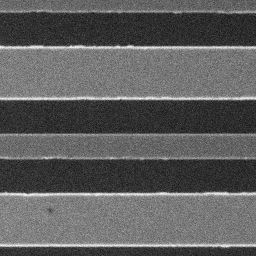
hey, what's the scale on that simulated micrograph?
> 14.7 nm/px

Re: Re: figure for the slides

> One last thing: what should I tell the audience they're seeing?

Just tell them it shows lines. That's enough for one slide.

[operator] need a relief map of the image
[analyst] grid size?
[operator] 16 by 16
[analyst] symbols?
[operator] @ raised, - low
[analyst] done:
@@@@@@@@@@@@@@@@
----------------
----------------
@@@@@@@@@@@@@@@@
@@@@@@@@@@@@@@@@
@@@@@@@@@@@@@@@@
----------------
----------------
@@@@@@@@@@@@@@@@
@@@@@@@@@@@@@@@@
----------------
----------------
@@@@@@@@@@@@@@@@
@@@@@@@@@@@@@@@@
@@@@@@@@@@@@@@@@
----------------